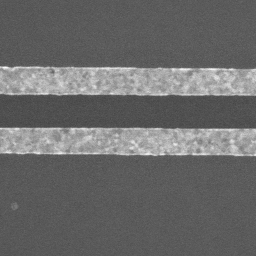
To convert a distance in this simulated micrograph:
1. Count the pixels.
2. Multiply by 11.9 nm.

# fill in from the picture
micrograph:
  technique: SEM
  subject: lines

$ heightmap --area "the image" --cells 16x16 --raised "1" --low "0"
0000000000000000
0000000000000000
0000000000000000
0000000000000000
1111111111111111
1111111111111111
0000000000000000
0000000000000000
1111111111111111
1111111111111111
0000000000000000
0000000000000000
0000000000000000
0000000000000000
0000000000000000
0000000000000000